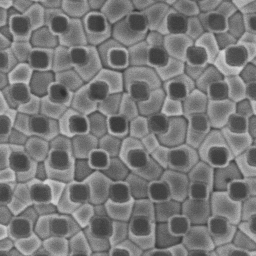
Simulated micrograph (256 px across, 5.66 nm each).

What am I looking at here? a regular array of raised bodies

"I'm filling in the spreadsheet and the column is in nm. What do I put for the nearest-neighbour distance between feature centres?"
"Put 104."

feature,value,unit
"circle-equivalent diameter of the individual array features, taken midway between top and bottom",109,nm